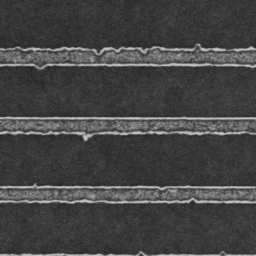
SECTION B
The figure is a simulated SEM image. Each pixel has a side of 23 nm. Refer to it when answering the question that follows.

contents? one or a few lines or trenches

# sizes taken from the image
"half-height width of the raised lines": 354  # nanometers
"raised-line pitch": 1580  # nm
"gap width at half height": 1220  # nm